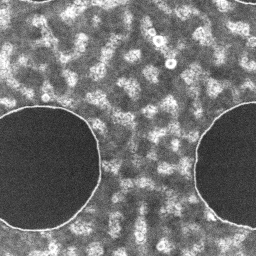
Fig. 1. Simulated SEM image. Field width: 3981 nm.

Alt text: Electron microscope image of raised bodies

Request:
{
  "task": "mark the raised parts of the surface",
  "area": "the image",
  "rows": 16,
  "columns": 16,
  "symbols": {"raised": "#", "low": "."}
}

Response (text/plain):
................
................
................
................
................
................
...............#
#####........###
######.......###
######......####
######......####
######......####
######.......###
#####.........##
................
................